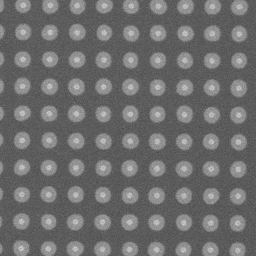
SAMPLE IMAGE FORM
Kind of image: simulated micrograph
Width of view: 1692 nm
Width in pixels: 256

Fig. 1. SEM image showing an array of small figures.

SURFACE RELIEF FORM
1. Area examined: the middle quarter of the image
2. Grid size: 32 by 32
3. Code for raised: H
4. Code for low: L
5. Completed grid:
LLHHHLLLHHHLLLLHHHLLLLHHHLLLLHHH
LLLLLLLLLLLLLLLLLLLLLLLLLLLLLLLL
LLLLLLLLLLLLLLLLLLLLLLLLLLLLLLLL
LLLLLLLLLLLLLLLLLLLLLLLLLLLLLLLL
LHHHHLLLHHHHLLLHHHLLLLHHHLLLLHHH
LHHHHLLLHHHHLLLHHHHLLLHHHLLLHHHH
LHHHHLLLHHHHLLLHHHLLLLHHHLLLHHHH
LLHHLLLLLHHLLLLHHHLLLLHHHLLLLHHL
LLLLLLLLLLLLLLLLLLLLLLLLLLLLLLLL
LLLLLLLLLLLLLLLLLLLLLLLLLLLLLLLL
LLHHLLLLLLLLLLLLHLLLLLLLLLLLLLHL
LHHHHLLLHHHLLLLHHHLLLLHHHLLLHHHH
LHHHHLLLHHHHLLLHHHLLLLHHHLLLHHHH
LHHHHLLLHHHLLLLHHHLLLLHHHLLLHHHH
LLLLLLLLLLLLLLLLHLLLLLLLLLLLLHHL
LLLLLLLLLLLLLLLLLLLLLLLLLLLLLLLL
LLLLLLLLLLLLLLLLLLLLLLLLLLLLLLLL
LLHHLLLLLHLLLLLLHLLLLLHHLLLLLLLL
LHHHHLLLHHHHLLLHHHLLLHHHHLLLHHHH
LHHHHLLLHHHHLLLHHHHLLHHHHLLLHHHH
LHHHHLLLHHHHLLLHHHLLLLHHHLLLHHHH
LLLLLLLLLLLLLLLLLLLLLLLLLLLLLLLL
LLLLLLLLLLLLLLLLLLLLLLLLLLLLLLLL
LLLLLLLLLLLLLLLLLLLLLLLLLLLLLLLL
LLHHLLLLLHHLLLLHHHLLLLHHLLLLLHHL
LHHHHLLLHHHHLLLHHHLLLHHHHLLLHHHH
LHHHHLLLHHHHLLLHHHLLLHHHHLLLHHHH
LLHHLLLLLHHLLLLHHHLLLLHHHLLLLHHH
LLLLLLLLLLLLLLLLLLLLLLLLLLLLLLLL
LLLLLLLLLLLLLLLLLLLLLLLLLLLLLLLL
LLLLLLLLLLLLLLLLLLLLLLLLLLLLLLLL
LHHHHLLLHHHLLLLHHHLLLLHHHLLLLHHL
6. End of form